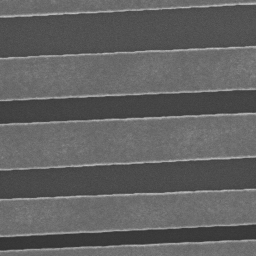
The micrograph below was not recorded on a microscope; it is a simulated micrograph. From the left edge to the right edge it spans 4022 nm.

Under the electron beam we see lines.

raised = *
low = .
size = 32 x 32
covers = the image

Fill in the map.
********************************
*************...................
................................
................................
................................
................................
................****************
********************************
********************************
********************************
********************************
*************************.......
**..............................
................................
......................**********
.*******************************
********************************
********************************
********************************
********************************
**************..................
................................
................................
................................
............********************
********************************
********************************
********************************
***********************.........
**..............................
....................************
********************************